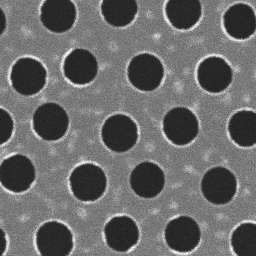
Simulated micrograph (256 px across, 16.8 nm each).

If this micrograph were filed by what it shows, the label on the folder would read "a regular array of holes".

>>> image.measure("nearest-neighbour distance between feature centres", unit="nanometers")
992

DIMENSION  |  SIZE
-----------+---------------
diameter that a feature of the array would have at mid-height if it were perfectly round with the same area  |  633 nm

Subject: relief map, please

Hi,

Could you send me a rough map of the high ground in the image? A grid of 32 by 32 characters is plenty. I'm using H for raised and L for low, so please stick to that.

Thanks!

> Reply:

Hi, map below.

HHHHHLLLLHHHHLLLLHHHHLLLLHHHHLLH
HHHHHLLLLLHHHLLLLHHHHLLLLHHHLLLL
LHHHHLLLLHHHHLLLLHHHHLLLLHHHLLLL
LHHHHHLLLHHHHHHHHHHHHHLLHHHHLLLL
HHHHHHHHHHHHHHHHHHHHHHHHHHHHHLLH
HHHHHHHHHHHHHHHHHHHHHHHHHHHHHHHH
HHHHHHHHHLLHHHHHHHHHHHHHHHHHHHHH
HHLLLHHHLLLLHHHHLLLLHHHHHLLLHHHH
HHLLLLHHLLLLHHHHLLLLHHHHHLLLLHHH
HLLLLLHHLLLLHHHHLLLLHHHHHLLLLHHH
HLLLLLHHHLLHHHHHLLLLHHHHHLLLLHHH
HHLLLHHHHHHHHHHHHHHHHHHHHHLLHHHH
HHHHHHHHHHHHHHHHHHHHHHHHHHHHHHHH
HHHHHLLLHHHHHHHHHHHHHHLHHHHHHHHH
LHHHLLLLHHHHHHLLHHHHHLLLHHHHHLLL
LLHHLLLLLHHHHLLLLHHHLLLLLHHHLLLL
LLHHLLLLHHHHHLLLLHHHLLLLLHHHHLLL
LHHHHHLHHHHHHLLLLHHHHLLLHHHHHLLL
HHHHHHHHHHHHHLLLHHHHHHHHHHHHHHHH
HLLHHHHHHHHHHHHHHHHHHHHHHHHHHHHH
LLLLHHHHHHLLHHHHHLLLHHHHHHHHHHHH
LLLLHHHHHLLLLHHHLLLLHHHHHHLLLHHH
LLLLHHHHHLLLLHHHLLLLLHHHHLLLLLHH
HLLLHHHHHLLLLHHHLLLLHHHHHLLLLLHH
HHHHHHHHHLLLLHHHHLLLHHHHHLLLLHHH
HHHHHHHHHHHHHHHHHHHHHHHHHHHLHHHH
HHHHHHHHHHHHHHHHHHHHHHHHHHHHHHHH
HHHHHHHHHHHHHHLLLHHHHLLLHHHHHHHH
HHHHHLLLLHHHHLLLLHHHHLLLLHHHHHLL
LHHHLLLLLHHHHLLLLHHHHLLLLHHHHLLL
LHHHHLLLLHHHHLLLLHHHHLLLLHHHHLLL
LHHHHLLLLHHHHHHHHHHHHHLLHHHHHLLL